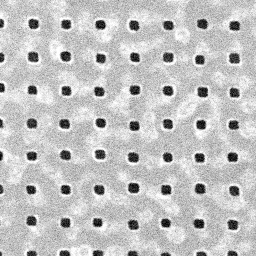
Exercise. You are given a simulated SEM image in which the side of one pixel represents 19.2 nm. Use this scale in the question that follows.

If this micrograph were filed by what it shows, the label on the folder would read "a regular array of holes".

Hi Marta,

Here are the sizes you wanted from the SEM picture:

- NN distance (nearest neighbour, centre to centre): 0.616 µm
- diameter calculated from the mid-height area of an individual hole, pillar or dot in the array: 222 nanometers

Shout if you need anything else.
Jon